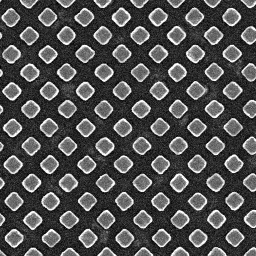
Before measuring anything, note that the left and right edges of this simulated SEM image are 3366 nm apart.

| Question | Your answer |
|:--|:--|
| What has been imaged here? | a regular array of raised bodies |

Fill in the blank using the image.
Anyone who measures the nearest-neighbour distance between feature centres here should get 0.338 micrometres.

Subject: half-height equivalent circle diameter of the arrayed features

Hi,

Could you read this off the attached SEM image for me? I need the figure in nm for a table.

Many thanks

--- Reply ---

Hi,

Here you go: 216